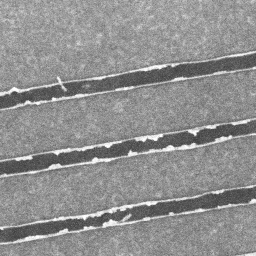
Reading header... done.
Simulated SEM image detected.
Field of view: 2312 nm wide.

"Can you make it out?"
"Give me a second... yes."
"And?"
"one or a few lines or trenches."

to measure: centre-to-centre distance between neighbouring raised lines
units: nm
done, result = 599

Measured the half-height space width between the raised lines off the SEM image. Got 443 nanometres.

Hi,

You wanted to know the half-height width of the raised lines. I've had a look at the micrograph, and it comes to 148 nm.